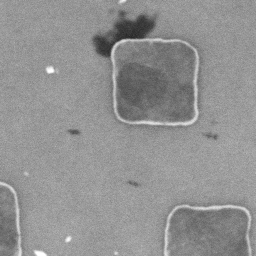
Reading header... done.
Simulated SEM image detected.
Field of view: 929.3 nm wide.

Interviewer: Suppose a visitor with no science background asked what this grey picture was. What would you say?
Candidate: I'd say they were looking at raised bodies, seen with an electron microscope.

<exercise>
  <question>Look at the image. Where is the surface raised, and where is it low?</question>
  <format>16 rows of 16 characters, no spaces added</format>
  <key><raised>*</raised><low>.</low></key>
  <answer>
................
................
................
.......*****....
.......*****....
.......*****....
.......*****....
........****....
................
................
................
................
*...............
*..........*****
*.........******
*.........******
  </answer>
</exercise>